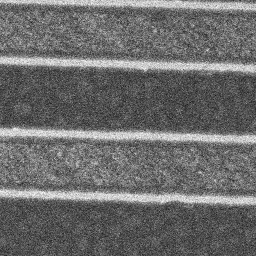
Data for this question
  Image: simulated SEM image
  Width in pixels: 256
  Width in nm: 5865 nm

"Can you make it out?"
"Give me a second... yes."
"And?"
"one or a few lines or trenches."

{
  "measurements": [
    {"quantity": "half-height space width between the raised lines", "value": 61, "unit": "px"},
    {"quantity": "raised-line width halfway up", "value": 1.63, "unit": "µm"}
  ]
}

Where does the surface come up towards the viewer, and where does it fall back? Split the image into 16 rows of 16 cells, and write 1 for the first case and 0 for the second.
0000000000000000
0000000000000000
0000000000000000
0000000000000000
1111111111111111
1111111111111111
1111111111111111
1111111111111111
0000000101111111
0000000000000000
0000000000000000
0000000000000000
1111111111111100
1111111111111111
1111111111111111
1111111111111111